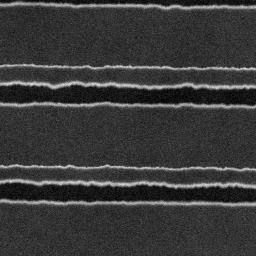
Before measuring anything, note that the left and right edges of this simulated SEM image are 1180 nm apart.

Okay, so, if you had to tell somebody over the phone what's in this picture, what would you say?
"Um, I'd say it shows lines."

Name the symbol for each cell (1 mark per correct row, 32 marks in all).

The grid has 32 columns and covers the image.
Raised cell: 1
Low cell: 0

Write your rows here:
00100000000000000000000000000000
11111111111111111111111111111111
11111111111111111111111111111111
11111111111111111111111111111111
11111111111111111111111111111111
11111111111111111111111111111111
11111111111111111111111111111111
11111111111111111111111111111111
11111111111111111111111111111111
11111111111111111111111111111111
10011111101111111111111111111111
00000000000000000000000000000000
00000000000000000000000000000000
11111111111111111111111111111111
11111111111111111111111111111111
11111111111111111111111111111111
11111111111111111111111111111111
11111111111111111111111111111111
11111111111111111111111111111111
11111111111111111111111111111111
11111111111111111111111111111111
11111111111111111111111111111111
11111111111111111111111111111111
00000000000000000000000000000000
00000000000000000000000000000000
11111111111111111111110011100000
11111111111111111111111111111111
11111111111111111111111111111111
11111111111111111111111111111111
11111111111111111111111111111111
11111111111111111111111111111111
11111111111111111111111111111111